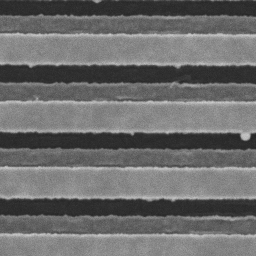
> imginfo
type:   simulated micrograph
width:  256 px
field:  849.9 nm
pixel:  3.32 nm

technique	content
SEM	lines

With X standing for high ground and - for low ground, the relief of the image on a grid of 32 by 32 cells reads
--------------------------------
--------------------------------
XXXXXXXXXXXXXXXXXXXXXXXXXXXXXXXX
XXXXXXXXXXXXXXXXXXXXXXXXXXXXXXXX
XXXXXXXXXXXXXXXXXXXXXXXXXXXXXXXX
XXXXXXXXXXXXXXXXXXXXXXXXXXXXXXXX
XXXXXXXXXXXXXXXXXXXXXXXXXXXXXXXX
XXXXXXXXXXXXXXXXXXXXXXXXXXXXXXXX
--------------------------------
--------------------------------
XXXXXXXXXXXXXXXXXXXXXXXXX-XXXXX-
XXXXXXXXXXXXXXXXXXXXXXXXXXXXXXXX
XXXXXXXXXXXXXXXXXXXXXXXXXXXXXXXX
XXXXXXXXXXXXXXXXXXXXXXXXXXXXXXXX
XXXXXXXXXXXXXXXXXXXXXXXXXXXXXXXX
XXXXXXXXXXXXXXXXXXXXXXXXXXXXXXXX
-X---XXX-XXXXXXXXXXXXXXXXXXXXXXX
------------------------------X-
--------------------------------
XXXXXXXXXXXXXXXXXXXXXXXXXXXXXXXX
XXXXXXXXXXXXXXXXXXXXXXXXXXXXXXXX
XXXXXXXXXXXXXXXXXXXXXXXXXXXXXXXX
XXXXXXXXXXXXXXXXXXXXXXXXXXXXXXXX
XXXXXXXXXXXXXXXXXXXXXXXXXXXXXXXX
XXXXXXXXXXXXXXXXXXXXXXXXXXXXXXXX
--------------------------------
--------------------------------
XXXXXXXXXXXXXXXXXXXXXXXXXXXXXXXX
XXXXXXXXXXXXXXXXXXXXXXXXXXXXXXXX
XXXXXXXXXXXXXXXXXXXXXXXXXXXXXXXX
XXXXXXXXXXXXXXXXXXXXXXXXXXXXXXXX
XXXXXXXXXXXXXXXXXXXXXXXXXXXXXXXX